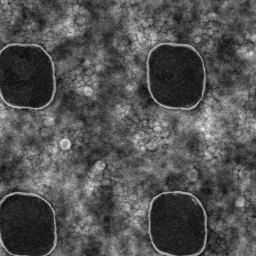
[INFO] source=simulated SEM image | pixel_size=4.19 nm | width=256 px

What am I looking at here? raised bodies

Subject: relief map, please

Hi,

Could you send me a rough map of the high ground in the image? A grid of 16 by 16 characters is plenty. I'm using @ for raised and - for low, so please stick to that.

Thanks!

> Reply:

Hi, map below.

----------------
----------------
----------------
@@@------@@@----
@@@------@@@@---
@@@------@@@@---
-@@-------@@----
----------------
----------------
----------------
----------------
----------------
@@@-------@@----
@@@------@@@@---
@@@------@@@@---
@@@-------@@@---